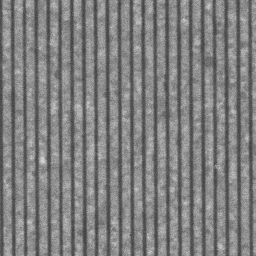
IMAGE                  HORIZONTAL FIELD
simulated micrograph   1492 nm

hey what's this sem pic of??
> parallel lines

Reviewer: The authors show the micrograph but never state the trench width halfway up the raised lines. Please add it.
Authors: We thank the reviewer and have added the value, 0.0255 um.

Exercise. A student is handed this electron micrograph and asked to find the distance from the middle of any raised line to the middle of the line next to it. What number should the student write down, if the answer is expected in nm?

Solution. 69.3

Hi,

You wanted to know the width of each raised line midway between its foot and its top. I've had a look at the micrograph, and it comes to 40.8 nm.